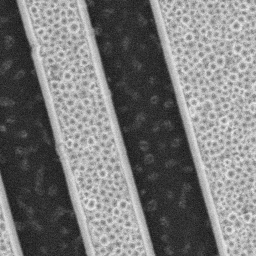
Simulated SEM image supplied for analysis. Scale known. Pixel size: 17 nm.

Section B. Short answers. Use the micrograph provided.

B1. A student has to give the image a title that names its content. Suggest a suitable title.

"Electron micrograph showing one or a few lines or trenches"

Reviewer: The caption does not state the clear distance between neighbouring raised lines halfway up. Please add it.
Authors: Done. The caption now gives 1180 nm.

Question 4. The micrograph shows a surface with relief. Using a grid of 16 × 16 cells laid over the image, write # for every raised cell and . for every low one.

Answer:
.####.....######
..###.....######
..####....######
..####.....#####
...###.....#####
...####....#####
...####....#####
...####.....####
....###.....####
....####....####
....####....####
....####.....###
.....###.....###
.....####....###
#....####.....##
#.....###.....##